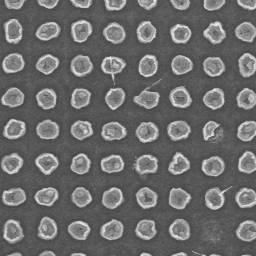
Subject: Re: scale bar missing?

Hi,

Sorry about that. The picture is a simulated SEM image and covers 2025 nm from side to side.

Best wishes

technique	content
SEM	a regular array of raised bodies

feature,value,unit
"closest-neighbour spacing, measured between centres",31.9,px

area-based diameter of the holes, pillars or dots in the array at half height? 156 nm